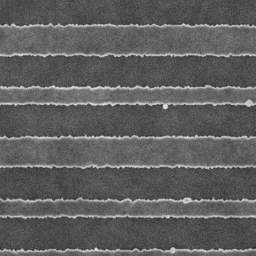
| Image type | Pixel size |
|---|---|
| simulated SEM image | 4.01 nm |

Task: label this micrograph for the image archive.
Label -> lines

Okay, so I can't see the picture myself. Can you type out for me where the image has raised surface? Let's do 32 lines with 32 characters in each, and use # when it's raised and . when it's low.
................................
................................
................................
################################
################################
################################
################################
................................
................................
................................
................................
################################
################################
................................
................................
................................
................................
################################
################################
################################
################################
................................
................................
................................
................................
################################
################################
................................
................................
................................
................................
################################